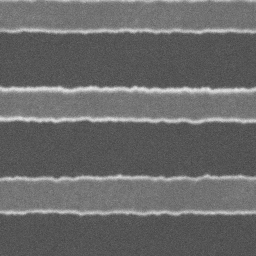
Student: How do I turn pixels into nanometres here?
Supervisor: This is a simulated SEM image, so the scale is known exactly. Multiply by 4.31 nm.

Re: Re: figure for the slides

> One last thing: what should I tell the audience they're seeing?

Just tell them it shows lines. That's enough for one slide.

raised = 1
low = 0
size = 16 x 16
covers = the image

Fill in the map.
1111111111111111
1111111111111111
0000000000000000
0000000000000000
0000000000000000
1011010110000000
1111111111111111
1111111111111111
0000000000000000
0000000000000000
0000000000000000
1111111111111111
1111111111111111
0000000000000000
0000000000000000
0000000000000000